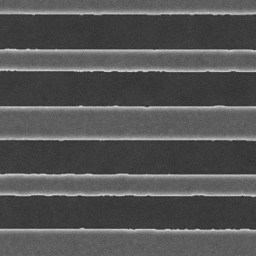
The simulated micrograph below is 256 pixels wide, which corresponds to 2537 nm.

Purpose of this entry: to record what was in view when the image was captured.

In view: lines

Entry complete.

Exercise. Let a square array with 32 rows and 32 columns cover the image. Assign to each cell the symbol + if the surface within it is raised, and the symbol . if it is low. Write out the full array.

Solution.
++++++++++++++++++++++++++++++++
++++++++++++++++++++++++++++++++
................................
................................
................................
................................
++++++++++++++++++++++++++++++++
++++++++++++++++++++++++++++++++
++++++++++++++++++++++++++++++++
................................
................................
................................
................................
++++++++++++++++++++++++++++++++
++++++++++++++++++++++++++++++++
++++++++++++++++++++++++++++++++
++++++++++++++++++++++++++++++++
................................
................................
................................
................................
................................
++++++++++++++++++++++++++++++++
++++++++++++++++++++++++++++++++
...............................+
................................
................................
................................
................................
++++++++++++++++++++++++++++++++
++++++++++++++++++++++++++++++++
++++++++++++++++++++++++++++++++